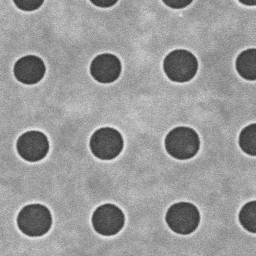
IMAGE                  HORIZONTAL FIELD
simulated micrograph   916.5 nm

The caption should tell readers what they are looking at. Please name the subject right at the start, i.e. a regular array of holes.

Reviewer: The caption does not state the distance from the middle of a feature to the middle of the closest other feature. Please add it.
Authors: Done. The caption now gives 267 nanometers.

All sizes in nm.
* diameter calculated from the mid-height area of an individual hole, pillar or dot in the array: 122